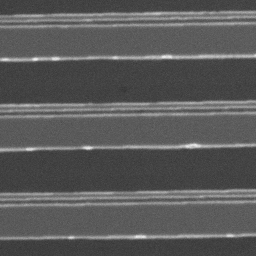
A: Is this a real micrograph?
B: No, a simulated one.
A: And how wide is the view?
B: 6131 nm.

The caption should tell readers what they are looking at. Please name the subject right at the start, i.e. lines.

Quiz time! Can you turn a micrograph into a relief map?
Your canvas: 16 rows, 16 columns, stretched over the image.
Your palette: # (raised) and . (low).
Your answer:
................
################
################
##############..
................
................
.........#######
################
################
................
................
................
################
################
################
................